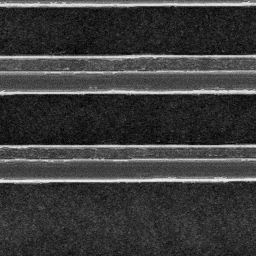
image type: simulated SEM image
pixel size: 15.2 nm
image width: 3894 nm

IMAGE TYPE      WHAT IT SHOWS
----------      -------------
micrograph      lines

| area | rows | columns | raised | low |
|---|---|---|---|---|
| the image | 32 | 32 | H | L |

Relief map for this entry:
HHHHHHHHHHHHHHHHHHHHHHHHHHHHHHHL
LLLLLLLLLLLLLLLLLLLLLLLLLLLLLLLL
LLLLLLLLLLLLLLLLLLLLLLLLLLLLLLLL
LLLLLLLLLLLLLLLLLLLLLLLLLLLLLLLL
LLLLLLLLLLLLLLLLLLLLLLLLLLLLLLLL
LLLLLLLLLLLLLLLLLLLLLLLLLLLLLLLL
LLLLLLLLLLLLLLLLLLLLLLLLLLLLLLLL
HHHHHHHHHHHHHHHHHHHHHHHHHHHHHHHH
HHHHHHHHHHHHHHHHHHHHHHHHHHHHHHHH
HHHHHHHHHHHHHHHHHHHHHHHHHHHHHHHH
HHHHHHHHHHHHHHHHHHHHHHHHHHHHHHHH
HHHHHHHHHHHHHHLHHHHHHHHHHLHHHLLH
LLLLLLLLLLLLLLLLLLLLLLLLLLLLLLLL
LLLLLLLLLLLLLLLLLLLLLLLLLLLLLLLL
LLLLLLLLLLLLLLLLLLLLLLLLLLLLLLLL
LLLLLLLLLLLLLLLLLLLLLLLLLLLLLLLL
LLLLLLLLLLLLLLLLLLLLLLLLLLLLLLLL
LLLLLLLLLLLLLLLLLLLLLLLLLLLLLLLL
HHHHHHHHHHHHHHHHHHHHHHHHHHHHHHHH
HHHHHHHHHHHHHHHHHHHHHHHHHHHHHHHH
HHHHHHHHHHHHHHHHHHHHHHHHHHHHHHHH
HHHHHHHHHHHHHHHHHHHHHHHHHHHHHHHH
HHHHHHHHHHHHHHHHHHHHLLLLLLLLLLLL
LLLLLLLLLLLLLLLLLLLLLLLLLLLLLLLL
LLLLLLLLLLLLLLLLLLLLLLLLLLLLLLLL
LLLLLLLLLLLLLLLLLLLLLLLLLLLLLLLL
LLLLLLLLLLLLLLLLLLLLLLLLLLLLLLLL
LLLLLLLLLLLLLLLLLLLLLLLLLLLLLLLL
LLLLLLLLLLLLLLLLLLLLLLLLLLLLLLLL
LLLLLLLLLLLLLLLLLLLLLLLLLLLLLLLL
LLLLLLLLLLLLLLLLLLLLLLLLLLLLLLLL
LLLLLLLLLLLLLLLLLLLLLLLLLLLLLLLL